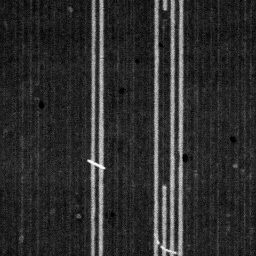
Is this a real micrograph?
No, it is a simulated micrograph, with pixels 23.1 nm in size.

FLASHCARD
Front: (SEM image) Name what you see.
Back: parallel lines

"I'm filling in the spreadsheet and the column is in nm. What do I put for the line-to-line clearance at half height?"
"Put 116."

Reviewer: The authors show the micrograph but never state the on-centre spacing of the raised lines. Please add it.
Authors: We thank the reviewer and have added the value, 184 nm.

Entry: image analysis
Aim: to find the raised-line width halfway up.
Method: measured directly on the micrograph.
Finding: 66.4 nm